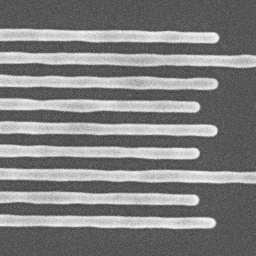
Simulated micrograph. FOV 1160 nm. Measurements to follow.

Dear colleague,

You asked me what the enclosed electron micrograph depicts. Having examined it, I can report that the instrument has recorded groups of lines, slits or small figures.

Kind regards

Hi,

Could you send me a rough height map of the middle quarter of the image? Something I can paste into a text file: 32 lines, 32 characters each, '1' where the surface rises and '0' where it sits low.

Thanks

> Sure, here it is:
00000000000000000011110000000000
00000000000000000000000000000000
00000000000000000000000000000000
10111111000000111111110000000000
11111111111111111111111111111111
11111111111111111111111111111111
00000000000000000000000000000000
00000000000000000000000000000000
00000000000000000000000000000000
11111111111111111111111111111110
11111111111111111111111111111111
11111111100011111111111111111111
00000000000000000000000000000000
00000000000000000000000000000000
00000000000000000000000000000000
11111111111111111111111111111111
11111111111111111111111111111111
00000001111100011111111111111111
00000000000000000000000000000000
00000000000000000000000000000000
00000000000000000000000000000000
11111111111111111111111111111111
11111111111111111111111111111111
00000000000000000000111111111111
00000000000000000000000000000000
00000000000000000000000000000000
00000000000000000000000000000000
11111111111111111111111111111111
11111111111111111111111111111111
00000000000000000000000000000000
00000000000000000000000000000000
00000000000000000000000000000000